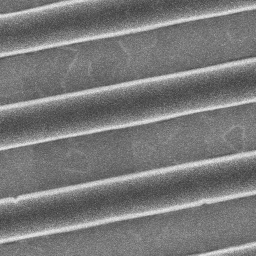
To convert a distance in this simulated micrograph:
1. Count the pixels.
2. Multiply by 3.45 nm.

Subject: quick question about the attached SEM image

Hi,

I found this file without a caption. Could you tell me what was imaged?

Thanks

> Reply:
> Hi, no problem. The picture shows one or a few lines or trenches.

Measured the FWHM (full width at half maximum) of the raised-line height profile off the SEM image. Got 140 nanometres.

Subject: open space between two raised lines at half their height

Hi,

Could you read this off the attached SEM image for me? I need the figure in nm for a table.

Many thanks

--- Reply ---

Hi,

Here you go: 174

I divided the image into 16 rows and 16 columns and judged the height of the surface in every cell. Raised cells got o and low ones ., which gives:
..oooooooooooooo
ooooooooooo.....
ooooo...........
................
............oooo
......oooooooooo
.oooooooooooooo.
oooooooooo......
oooo............
................
...........ooooo
......oooooooooo
oooooooooooooo..
ooooooooo.......
ooo.............
...............o